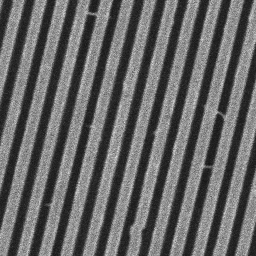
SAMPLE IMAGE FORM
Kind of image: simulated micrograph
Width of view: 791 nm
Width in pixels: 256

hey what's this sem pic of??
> parallel lines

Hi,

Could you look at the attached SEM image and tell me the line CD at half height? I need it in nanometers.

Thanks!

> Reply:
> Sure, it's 41.6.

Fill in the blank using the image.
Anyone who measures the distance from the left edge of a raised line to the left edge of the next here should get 65.6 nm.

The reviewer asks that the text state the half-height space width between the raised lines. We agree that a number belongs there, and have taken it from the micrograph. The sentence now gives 0.0259 um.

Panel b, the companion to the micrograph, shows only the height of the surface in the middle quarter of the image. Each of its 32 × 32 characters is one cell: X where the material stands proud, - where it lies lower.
XXX--XXX--XXXX--XXX--XXXX--XXX--
XXX--XXX--XXXX--XXX--XXXX--XXX--
XX--XXXX--XXX---XXX--XXX--XXXX--
XX--XXXX--XXX--XXX---XXX--XXX---
XX--XXX--XXXX--XXX--XXXX--XXX--X
XX--XXX--XXXX--XXX--XXX---XXX--X
X--XXXX--XXX---XXX--XXX--XXXX--X
X--XXXX--XXX--XXX---XXX--XXX---X
X--XXX--XXXX--XXX--XXXX--XXX--XX
X--XXX--XXXX--XXX--XXX---XXX--XX
--XXXX--XXX---XXX--XXX--XXXX--XX
--XXXX--XXX--XXXX--XXX--XXX---XX
--XXX--XXXX--XXX---XXX--XXX--XXX
--XXX--XXXX--XXX--XXX---XXX--XXX
--XXX--XXX---XXX--XXX--XXXX--XXX
-XXXX-XXXX--XXXX--XXX--XXX---XXX
-XXX--XXXX--XXX---XXX--XXX--XXXX
-XXX--XXXX--XXX--XXXX-XXXX--XXX-
-XXX--XXX---XXX--XXX--XXXX--XXX-
XXXX--XXX--XXXX--XXX--XXXX--XXX-
XXX--XXXX--XXX---XXX--XXX--XXXX-
XXX--XXXX--XXX--XXXX--XXX--XXXX-
XXX--XXX---XXX--XXX---XXX--XXX--
XXX--XXX--XXXX--XXX--XXX---XXX--
XX---XXX--XXX---XXX--XXX--XXXX--
XX--XXXX--XXX--XXXX--XXX--XXXX--
XX--XXX---XXX--XXX---XXX--XXX--X
XX--XXX--XXXX--XXX--XXXX--XXX--X
XX--XXX--XXX---XXX--XXX---XXX--X
X--XXXX--XXX--XXXX--XXX--XXXX--X
X--XXX---XXX--XXX---XXX--XXX--XX
X--XXX--XXXX--XXX--XXXX--XXX--XX